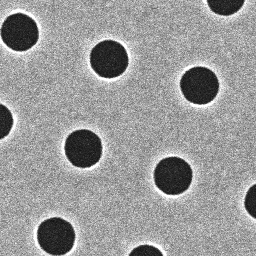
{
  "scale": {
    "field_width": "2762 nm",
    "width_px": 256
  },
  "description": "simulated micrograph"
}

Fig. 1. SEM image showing holes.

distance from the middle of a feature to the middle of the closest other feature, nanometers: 1010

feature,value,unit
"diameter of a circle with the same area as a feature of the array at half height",424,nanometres